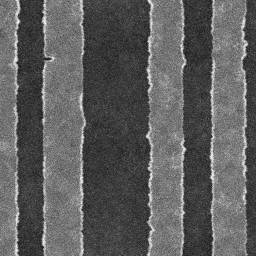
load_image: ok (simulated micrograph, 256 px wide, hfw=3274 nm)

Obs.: one or a few lines or trenches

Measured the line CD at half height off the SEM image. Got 440 nm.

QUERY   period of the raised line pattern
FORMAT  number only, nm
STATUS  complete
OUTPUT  1060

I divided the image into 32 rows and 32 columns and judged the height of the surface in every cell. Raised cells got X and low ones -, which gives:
XX---XXXXX---------XXXX----XXXX-
XX---XXXXX---------XXXX----XXXX-
XX---XXXXX---------XXXX----XXXX-
XX---XXXXX---------XXXX---XXXX--
XX---XXXXX---------XXXX----XXXX-
XX----XXXX---------XXXX----XXXX-
XX----XXXX---------XXXX----XXXX-
XX----XXXX---------XXXX----XXX--
XX---XXXXX--------XXXXX----XXX--
XX---XXXXX--------XXXXX----XXXX-
XX---XXXXX---------XXXX----XXXX-
XX---XXXXX---------XXXX---XXXXX-
XX---XXXXX---------XXXX---XXXXX-
XX---XXXXX---------XXXX---XXXXX-
XX---XXXXXX--------XXXX---XXXXX-
XX---XXXXXX--------XXXX----XXXX-
XX---XXXXX---------XXXX----XXXX-
XX---XXXXX---------XXXX---XXXXX-
XX---XXXXX---------XXXX---XXXXX-
XX---XXXXX---------XXXX---XXXXX-
XX---XXXXX---------XXXX---XXXXX-
XX---XXXXX---------XXXX---XXXXX-
XX---XXXXX---------XXXX---XXXXX-
XX---XXXXX---------XXXX----XXXX-
XX----XXXX---------XXXX----XXXX-
XX---XXXXX---------XXXX---XXXXX-
XX---XXXXX---------XXXX---XXXXX-
XX----XXXX---------XXXX----XXXX-
XX---XXXXX---------XXXX----XXXX-
XX---XXXXX---------XXXX----XXXX-
XX---XXXXX---------XXXX----XXXX-
XX---XXXXX--------XXXXX----XXXX-